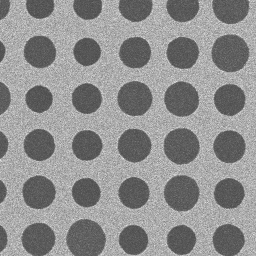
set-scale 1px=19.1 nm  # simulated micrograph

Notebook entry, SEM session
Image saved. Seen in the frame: a regular array of holes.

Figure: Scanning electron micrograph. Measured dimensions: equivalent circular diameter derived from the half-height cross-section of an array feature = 609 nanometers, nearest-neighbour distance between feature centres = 894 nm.